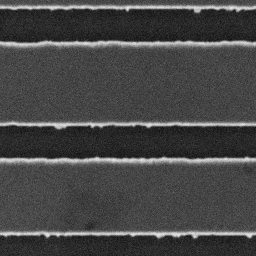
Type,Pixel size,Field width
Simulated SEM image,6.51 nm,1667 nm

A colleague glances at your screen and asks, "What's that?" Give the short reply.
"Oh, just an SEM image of lines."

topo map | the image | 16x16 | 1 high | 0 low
1111111111111111
0000000000000000
0000000000000000
1111111111111111
1111111111111111
1111111111111111
1111111111111111
1111111111111111
0000000000000000
0000000000000000
1111111111111111
1111111111111111
1111111111111111
1111111111111111
1111111111111111
0000000000000000